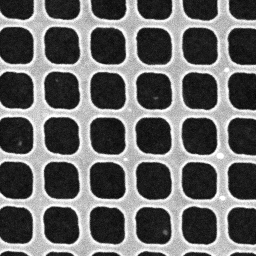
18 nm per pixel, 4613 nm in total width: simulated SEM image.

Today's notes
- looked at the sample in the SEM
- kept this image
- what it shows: a regular array of holes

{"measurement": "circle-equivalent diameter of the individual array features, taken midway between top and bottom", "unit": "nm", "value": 712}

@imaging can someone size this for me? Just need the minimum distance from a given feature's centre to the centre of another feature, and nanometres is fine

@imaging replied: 804